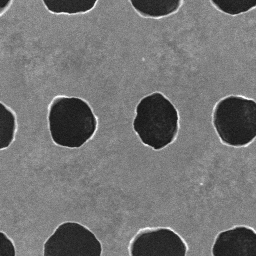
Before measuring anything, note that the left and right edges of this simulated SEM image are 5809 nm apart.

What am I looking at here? holes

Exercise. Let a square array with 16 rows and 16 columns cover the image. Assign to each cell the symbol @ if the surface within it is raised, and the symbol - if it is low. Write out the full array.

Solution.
@@@---@@---@@@--
@@@@@@@@@@@@@@@@
@@@@@@@@@@@@@@@@
@@@@@@@@@@@@@@@@
@@@@@@@@@@@@@@@@
@@@@@@@@@@@@@@@@
@@@--@@@@--@@@--
-@@---@@---@@---
-@@---@@@--@@@--
@@@@@@@@@@@@@@@@
@@@@@@@@@@@@@@@@
@@@@@@@@@@@@@@@@
@@@@@@@@@@@@@@@@
@@@@@@@@@@@@@@@@
@@@---@@@--@@@--
-@@---@@----@---